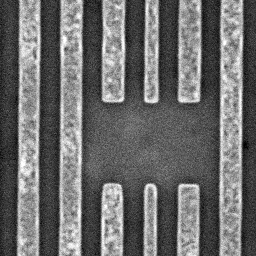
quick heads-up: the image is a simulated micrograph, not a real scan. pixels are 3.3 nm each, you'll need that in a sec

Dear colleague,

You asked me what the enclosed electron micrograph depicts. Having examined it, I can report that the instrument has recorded wiring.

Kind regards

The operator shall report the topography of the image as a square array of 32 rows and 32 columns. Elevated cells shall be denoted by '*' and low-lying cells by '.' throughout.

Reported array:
...**...**...***..**..***...**..
...**...**...***..**..***...**..
...**...**...***..**..***...**..
...**...**...***..**..***...**..
..***...**...***..**..***...**..
..***...**...***..**..***...**..
..***...**...***..**..***...**..
..***...**...***..**..***...**..
...**...**...***..**..***...**..
...**...**...***..**..***...**..
..***...**...**...**..***...**..
..***...**...**...**..***...**..
..***...**...**...**...**...**..
..***...**..................**..
..***...**..................**..
..***...**..................**..
..***...**..................**..
..***...**..................**..
..***...**..................**..
..***...**..................**..
..***...**..................**..
..***...**..................**..
..***...**..................**..
..***..***...**...*...***...**..
..***..***...**...**..***...**..
..***...**...**...*...***...**..
..***...**...**...*...***...**..
..***...**...**...*...***...**..
..***..***...**...*...***...**..
..***..***...**...*...***...**..
..***..***...**...*...***...**..
..***..***...**...*...***...**..